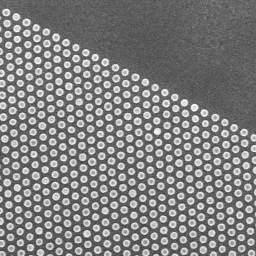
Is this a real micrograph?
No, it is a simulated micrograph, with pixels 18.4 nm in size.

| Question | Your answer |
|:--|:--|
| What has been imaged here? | a regular array of raised bodies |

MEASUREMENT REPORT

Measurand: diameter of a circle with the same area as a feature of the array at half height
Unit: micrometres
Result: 0.123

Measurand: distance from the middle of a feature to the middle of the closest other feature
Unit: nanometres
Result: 195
